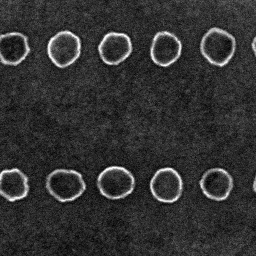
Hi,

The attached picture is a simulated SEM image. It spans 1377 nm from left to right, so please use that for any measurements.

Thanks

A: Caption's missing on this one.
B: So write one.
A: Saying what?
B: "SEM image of a regular array of raised bodies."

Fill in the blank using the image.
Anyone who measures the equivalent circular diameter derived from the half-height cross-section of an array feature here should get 173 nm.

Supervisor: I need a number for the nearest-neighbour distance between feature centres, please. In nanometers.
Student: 271